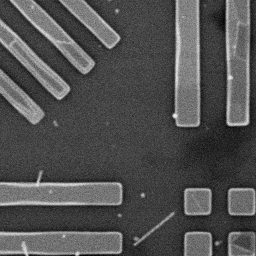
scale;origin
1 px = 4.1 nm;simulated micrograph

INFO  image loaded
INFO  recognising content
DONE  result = groups of lines, slits or small figures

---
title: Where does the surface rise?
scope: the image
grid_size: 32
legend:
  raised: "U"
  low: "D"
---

DDUUUDDDUUUDDDDDDDDDDDUUUDDDUUUD
DDDUUUDDDUUUDDDDDDDDDDUUUDDDUUUD
DDDDUUUDDDUUUDDDDDDDDDUUUDDDUUUD
UDDDDUUUDDDUUUDDDDDDDDUUUDDDUUUD
UUDDDDUUUDDDUUUDDDDDDDUUUDDDUUUD
UUUDDDDUUUDDDUDDDDDDDDUUUDDDUUUD
DUUUDDDDUUUDDDDDDDDDDDUUUDDDUUUD
DDUUUDDDDUUDDDDDDDDDDDUUUDDDUUUD
DDDUUUDDDDUDDDDDDDDDDDUUUDDDDUUD
UDDDUUUDDDDDDDDDDDDDDDUUUDDDDUUD
UUDDDUUUDDDDDDDDDDDDDDUUUDDDDUUD
UUUDDDUUDDDDDDDDDDDDDDUUUDDDDUUD
DUUUDDDDDDDDDDDDDDDDDDUUUDDDDUUD
DDUUUDDDDDDDDDDDDDDDDDUUUDDDUUUD
DDDUUDDDDDDDDDDDDDDDDDUUUDDDUUUD
DDDDDDDDDDDDDDDDDDDDDDUUUDDDDUUD
DDDDDDDDDDDDDDDDDDDDDDDDDDDDDDDD
DDDDDDDDDDDDDDDDDDDDDDDDDDDDDDDD
DDDDDDDDDDDDDDDDDDDDDDDDDDDDDDDD
DDDDDDDDDDDDDDDDDDDDDDDDDDDDDDDD
DDDDDDDDDDDDDDDDDDDDDDDDDDDDDDDD
DDDDDDDDDDDDDDDDDDDDDDDDDDDDDDDD
DDDDDDDDDDDDDDDDDDDDDDDDDDDDDDDD
UUUUUUUUUUUUUUUDDDDDDDDDDDDDDDDD
UUUUUUUUUUUUUUUDDDDDDDDUUUDDDUUU
UDDDDDDDDDDDUUUDDDDDDDDUUUDDDUUU
DDDDDDDDDDDDDDDDDDDDDDDUUUDDDUUU
DDDDDDDDDDDDDDDDDDDDDDDDDDDDDDDD
DDDDDDDDDDDDDDDDDDDDDDDDDDDDDDDD
UUUUUUUUUUUUUUUDDDDDDDDUUUDDDUUU
UUUUUUUUUUUUUUUDDDDDDDDUUUDDDUUU
UUUUUUUUUUUUUUUDDDDDDDDUUUDDDUUU